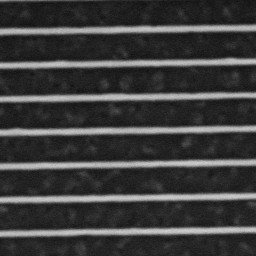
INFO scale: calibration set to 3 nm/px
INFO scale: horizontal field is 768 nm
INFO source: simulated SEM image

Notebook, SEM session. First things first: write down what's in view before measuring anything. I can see parallel lines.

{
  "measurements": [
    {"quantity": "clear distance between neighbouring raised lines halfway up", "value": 83.3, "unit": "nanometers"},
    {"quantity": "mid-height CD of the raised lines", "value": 5.37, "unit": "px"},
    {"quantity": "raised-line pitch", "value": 0.101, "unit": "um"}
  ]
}